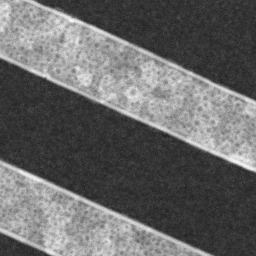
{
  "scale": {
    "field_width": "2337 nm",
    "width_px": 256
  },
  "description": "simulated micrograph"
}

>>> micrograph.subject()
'one or a few lines or trenches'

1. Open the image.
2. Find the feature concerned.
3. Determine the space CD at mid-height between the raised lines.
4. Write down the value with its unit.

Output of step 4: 885 nm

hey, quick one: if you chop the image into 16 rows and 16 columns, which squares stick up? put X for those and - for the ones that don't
XXX-------------
XXXXX-----------
XXXXXXX---------
XXXXXXXXXX------
--XXXXXXXXXX----
----XXXXXXXXXX--
-------XXXXXXXXX
---------XXXXXXX
-----------XXXXX
-------------XXX
X---------------
XXX-------------
XXXXX-----------
XXXXXXX---------
XXXXXXXXXX------
---XXXXXXXXX----